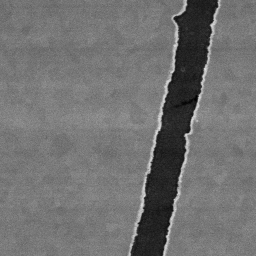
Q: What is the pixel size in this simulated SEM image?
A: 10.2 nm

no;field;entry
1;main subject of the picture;one or a few lines or trenches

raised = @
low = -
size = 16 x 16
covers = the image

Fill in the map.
@@@@@@@@@@@---@@
@@@@@@@@@@@--@@@
@@@@@@@@@@@--@@@
@@@@@@@@@@@--@@@
@@@@@@@@@@@--@@@
@@@@@@@@@@---@@@
@@@@@@@@@@--@@@@
@@@@@@@@@@--@@@@
@@@@@@@@@@--@@@@
@@@@@@@@@@--@@@@
@@@@@@@@@--@@@@@
@@@@@@@@@--@@@@@
@@@@@@@@@--@@@@@
@@@@@@@@@--@@@@@
@@@@@@@@---@@@@@
@@@@@@@@--@@@@@@